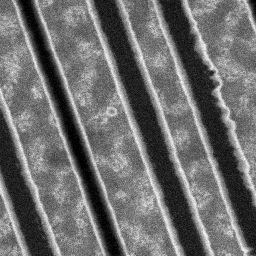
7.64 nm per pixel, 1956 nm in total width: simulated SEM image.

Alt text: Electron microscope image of one or a few lines or trenches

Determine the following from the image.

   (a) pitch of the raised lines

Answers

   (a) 0.534 um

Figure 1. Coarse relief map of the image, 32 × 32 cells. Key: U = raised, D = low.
UUDDUUUUUUUDDDDUUUUUDDDUUUUUUUUD
UUUDDUUUUUUUDDDUUUUUDDDUUUUUUUUU
UUUDDUUUUUUUDDDDUUUUDDDDUUUUUUUU
UUUDDUUUUUUUDDDDUUUUUDDDUUUUUUUU
UUUUDDUUUUUUUDDDUUUUUDDDDUUUUUUU
UUUUDDUUUUUUUDDDDUUUUUDDDUUUUUUU
UUUUDDUUUUUUUUDDDUUUUUDDDUUUUUUU
UUUUUDDUUUUUUUDDDUUUUUDDDDUUUUUU
UUUUUDDUUUUUUUDDDDUUUUUDDDUUUUUU
UUUUUUDDUUUUUUUDDDUUUUUDDDDUUUUU
UUUUUUDDUUUUUUUDDDDUUUUDDDDUUUUU
UUUUUUDDUUUUUUUDDDDUUUUUDDDUUUUU
UUUUUUUDDUUUUUUUDDDUUUUUDDDUUUUU
UUUUUUUDDUUUUUUUDDDDUUUUDDDDUUUU
DUUUUUUDDUUUUUUUDDDDUUUUUDDDUUUU
DUUUUUUUDDUUUUUUUDDDUUUUUDDDUUUU
DDUUUUUUDDUUUUUUUDDDDUUUUDDDDUUU
DDUUUUUUDDUUUUUUUUDDDUUUUUDDDUUU
DDUUUUUUUDDUUUUUUUDDDUUUUUDDDDUU
DDDUUUUUUDDUUUUUUUDDDDUUUUDDDDUU
DDDUUUUUUDDUUUUUUUUDDDUUUUUDDDUU
DDDUUUUUUUDDUUUUUUUDDDUUUUUDDDDU
DDDDUUUUUUDDUUUUUUUDDDDUUUUUDDDU
DDDDUUUUUUDDDUUUUUUUDDDUUUUUDDDU
UDDDUUUUUUUDDUUUUUUUDDDDUUUUDDDD
UDDDDUUUUUUDDUUUUUUUDDDDUUUUUDDD
UDDDDUUUUUUDDDUUUUUUUDDDUUUUUDDD
UUDDDUUUUUUUDDUUUUUUUDDDUUUUUDDD
UUDDDDUUUUUUDDUUUUUUUDDDDUUUUUDD
UUUDDDUUUUUUUDDUUUUUUUDDDUUUUUDD
UUUDDDDUUUUUUDDUUUUUUUDDDDUUUUDD
UUUDDDDUUUUUUDDUUUUUUUUDDDUUUUUD